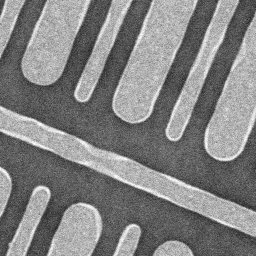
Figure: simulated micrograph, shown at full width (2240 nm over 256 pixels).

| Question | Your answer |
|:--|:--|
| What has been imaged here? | groups of lines, slits or small figures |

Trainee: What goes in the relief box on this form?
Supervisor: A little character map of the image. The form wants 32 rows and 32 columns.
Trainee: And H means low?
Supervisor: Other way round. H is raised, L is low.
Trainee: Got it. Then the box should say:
LHHLLLHHHHHLLLHHLLLHHHHHLLLHHHLL
HHLLLHHHHHLLLLHLLLLHHHHHLLLHHLLL
HHLLLHHHHHLLLHHLLLHHHHHHLLLHHLLL
HHLLLHHHHHLLLHHLLLHHHHHLLLHHLLLH
HLLLHHHHHLLLHHLLLLHHHHHLLLHHLLLH
HLLLHHHHHLLLHHLLLHHHHHHLLLHLLLLH
LLLHHHHHHLLLHHLLLHHHHHLLLHHLLLHH
LLLHHHHHLLLHHLLLHHHHHHLLLHLLLLHH
LLLHHHHHLLLHHLLLHHHHHLLLHHLLLHHH
LLLHHHHLLLHHLLLHHHHHHLLLHHLLLHHH
LLLLLHLLLLHHLLLHHHHHLLLHHLLLHHHH
LLLLLLLLLLHLLLLHHHHHLLLHHLLLHHHH
LLLLLLLLLLHLLLHHHHHLLLHHHLLHHHHH
LLLLLLLLLLLLLLHHHHHLLLHHLLLHHHHH
HHLLLLLLLLLLLLLHHHLLLLHHLLLHHHHH
HHHHHLLLLLLLLLLLLLLLLHHLLLHHHHHL
LHHHHHHLLLLLLLLLLLLLLHHLLLHHHHHL
LLLHHHHHHHLLLLLLLLLLLLLLLLHHHHHL
LLLLLLHHHHHLLLLLLLLLLLLLLLHHHHLL
LLLLLLLLHHHHHHLLLLLLLLLLLLHHHLLL
LLLLLLLLLLLHHHHHHLLLLLLLLLLLLLLL
HLLLLLLLLLLLLLHHHHHHLLLLLLLLLLLL
HLLLLLLLLLLLLLLHHHHHHHLLLLLLLLLL
HLLLLLLLLLLLLLLLLLHHHHHHLLLLLLLL
HLLLHHLLLLLLLLLLLLLLHHHHHHHLLLLL
HLLLHHLLLLLLLLLLLLLLLLHHHHHHHLLL
LLLHHLLLHHHHLLLLLLLLLLLLLHHHHHHH
LLLHHLLLHHHHLLLLLLLLLLLLLLLHHHHH
LLHHLLLHHHHHLLLLHLLLLLLLLLLLLHHH
LLHHLLLHHHHHLLLHHLLLLLLLLLLLLLLL
LHHHLLLHHHHHLLLHHLLLHHHLLLLLLLLL
LHHLLLHHHHHLLLLHHLLHHHHHLLLLLLLL